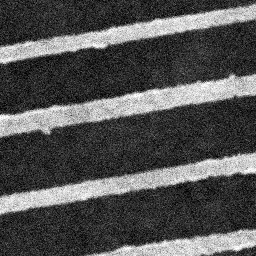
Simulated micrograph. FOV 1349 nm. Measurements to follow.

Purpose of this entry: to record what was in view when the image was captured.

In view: one or a few lines or trenches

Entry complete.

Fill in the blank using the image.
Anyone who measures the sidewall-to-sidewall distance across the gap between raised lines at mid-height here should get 300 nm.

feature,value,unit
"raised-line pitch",390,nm